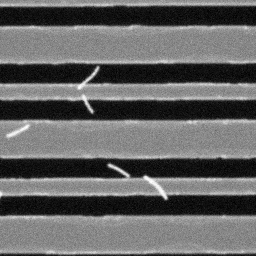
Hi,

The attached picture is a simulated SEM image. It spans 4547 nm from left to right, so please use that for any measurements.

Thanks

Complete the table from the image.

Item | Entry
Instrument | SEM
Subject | lines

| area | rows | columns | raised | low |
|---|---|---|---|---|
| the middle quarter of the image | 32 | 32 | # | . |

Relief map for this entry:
................................
................................
................................
................................
................................
################################
################################
################################
.###.#.....###.##.....#########.
................................
................................
................................
................................
................................
...............................#
################################
################################
################################
################################
################################
################################
################################
################################
................................
................................
................................
................................
................................
....................#...........
################################
################################
################################